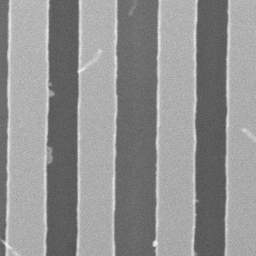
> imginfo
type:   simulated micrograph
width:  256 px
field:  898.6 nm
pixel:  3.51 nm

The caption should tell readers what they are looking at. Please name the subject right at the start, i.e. lines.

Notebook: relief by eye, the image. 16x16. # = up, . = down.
.##..##...##..##
.##..##...##..##
.##..##...##..##
###..##...##..##
.##..##...##..##
###..##...##..##
###..##...##..##
###..##...##..##
###..##...##..##
###..##...##..##
###..##...##..##
###..##...##..##
###..##...##..##
###..##...##..##
###..##...##..##
###..##...##..##